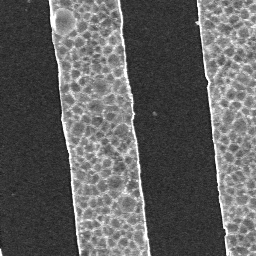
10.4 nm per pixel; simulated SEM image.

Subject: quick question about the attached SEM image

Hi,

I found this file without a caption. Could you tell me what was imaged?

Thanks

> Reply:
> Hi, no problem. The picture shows one or a few lines or trenches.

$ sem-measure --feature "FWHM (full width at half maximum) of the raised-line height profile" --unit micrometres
0.719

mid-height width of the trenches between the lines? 799 nanometers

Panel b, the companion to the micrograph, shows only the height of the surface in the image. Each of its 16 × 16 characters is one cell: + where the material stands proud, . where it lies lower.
...+++++....++++
...+++++....++++
...+++++.....+++
....++++.....+++
....++++.....+++
....++++.....+++
....++++.....+++
....++++.....+++
....++++.....+++
....+++++....+++
....+++++.....++
....+++++.....++
.....++++.....++
.....++++.....++
.....++++.....++
.....++++.....++